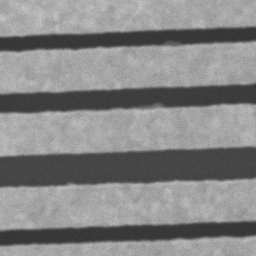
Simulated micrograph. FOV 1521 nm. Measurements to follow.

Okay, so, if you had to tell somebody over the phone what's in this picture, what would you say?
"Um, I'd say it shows lines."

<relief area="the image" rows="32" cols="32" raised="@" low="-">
@@@@@@@@@@@@@@@@@@@@@@@@@@@@@@@@
@@@@@@@@@@@@@@@@@@@@@@@@@@@@@@@@
@@@@@@@@@@@@@@@@@@@@@@@@@@@@@@@@
@@@@@@@@@@@@@@@@@@@@@@@@@@@-----
@-------------------------------
-------------------------@@@@@@@
@@@@@@@@@@@@@@@@@@@@@@@@@@@@@@@@
@@@@@@@@@@@@@@@@@@@@@@@@@@@@@@@@
@@@@@@@@@@@@@@@@@@@@@@@@@@@@@@@@
@@@@@@@@@@@@@@@@@@@@@@@@@@@@@@@@
@@@@@@@@@@@@@@@@@@@@@@@@@@@@@@@-
@@@@----------------------------
--------------------------------
-------------------@@@@@@@@@@@@@
@@@@@@@@@@@@@@@@@@@@@@@@@@@@@@@@
@@@@@@@@@@@@@@@@@@@@@@@@@@@@@@@@
@@@@@@@@@@@@@@@@@@@@@@@@@@@@@@@@
@@@@@@@@@@@@@@@@@@@@@@@@@@@@@@@@
@@@@@@@@@@@@@@@@@@@@@@@@@-------
--------------------------------
--------------------------------
--------------------------------
-----------------------------@@@
-@@@@@@@@@@@@@@@@@@@@@@@@@@@@@@@
@@@@@@@@@@@@@@@@@@@@@@@@@@@@@@@@
@@@@@@@@@@@@@@@@@@@@@@@@@@@@@@@@
@@@@@@@@@@@@@@@@@@@@@@@@@@@@@@@@
@@@@@@@@@@@@@@@@@@@@@@@@@@@@@@@@
@@@@@@@-------------------------
-------------------------------@
--------@@@@@@@@@@@@@@@@@@@@@@@@
@@@@@@@@@@@@@@@@@@@@@@@@@@@@@@@@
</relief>